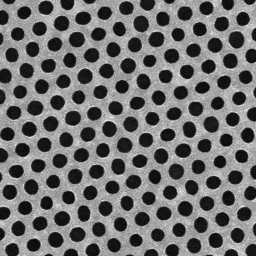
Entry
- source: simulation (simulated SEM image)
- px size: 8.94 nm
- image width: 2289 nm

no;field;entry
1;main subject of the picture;a regular array of holes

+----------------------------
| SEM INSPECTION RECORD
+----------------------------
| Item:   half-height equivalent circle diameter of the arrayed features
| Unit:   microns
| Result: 0.129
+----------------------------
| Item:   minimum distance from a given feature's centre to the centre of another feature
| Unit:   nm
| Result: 194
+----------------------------